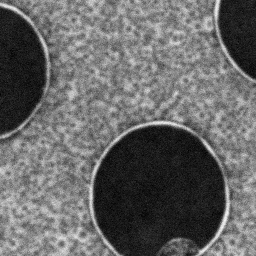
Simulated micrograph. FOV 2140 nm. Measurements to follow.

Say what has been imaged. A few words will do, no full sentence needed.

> raised bodies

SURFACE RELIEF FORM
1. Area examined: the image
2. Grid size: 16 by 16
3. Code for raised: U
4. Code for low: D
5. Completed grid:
UDDDDDDDDDDDDDUU
UUDDDDDDDDDDDDUU
UUUDDDDDDDDDDDUU
UUUDDDDDDDDDDDUU
UUUDDDDDDDDDDDDU
UUUDDDDDDDDDDDDD
UUDDDDDDDDDDDDDD
UUDDDDDDDDDDDDDD
DDDDDDDDUUUUDDDD
DDDDDDDUUUUUUDDD
DDDDDDUUUUUUUUDD
DDDDDDUUUUUUUUDD
DDDDDDUUUUUUUUDD
DDDDDDUUUUUUUUDD
DDDDDDUUUUUUUUDD
DDDDDDDUUUUUUDDD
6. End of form